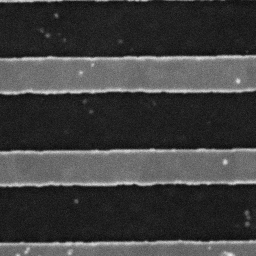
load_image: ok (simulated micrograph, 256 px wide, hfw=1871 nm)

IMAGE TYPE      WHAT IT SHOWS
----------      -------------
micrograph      lines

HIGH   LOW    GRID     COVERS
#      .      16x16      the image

................
................
................
................
################
################
................
................
................
################
################
##########.####.
................
................
................
################